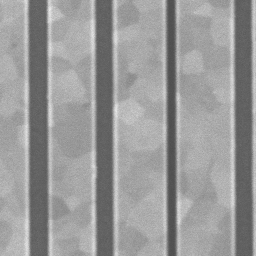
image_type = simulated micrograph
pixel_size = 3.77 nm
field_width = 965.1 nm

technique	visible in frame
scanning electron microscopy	one or a few lines or trenches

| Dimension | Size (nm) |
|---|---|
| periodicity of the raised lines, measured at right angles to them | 251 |